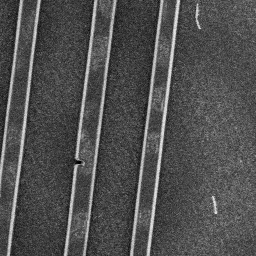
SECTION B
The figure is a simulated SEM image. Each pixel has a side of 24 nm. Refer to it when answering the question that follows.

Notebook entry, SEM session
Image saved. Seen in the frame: one or a few lines or trenches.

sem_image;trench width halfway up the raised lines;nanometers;1230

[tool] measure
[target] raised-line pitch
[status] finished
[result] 1.62 um